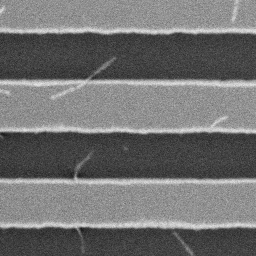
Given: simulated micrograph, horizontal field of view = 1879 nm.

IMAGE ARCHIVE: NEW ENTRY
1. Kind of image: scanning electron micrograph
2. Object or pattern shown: lines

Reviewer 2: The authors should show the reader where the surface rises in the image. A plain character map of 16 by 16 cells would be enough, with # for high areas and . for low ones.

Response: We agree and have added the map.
################
################
................
................
................
################
################
################
................
................
................
################
################
################
................
................